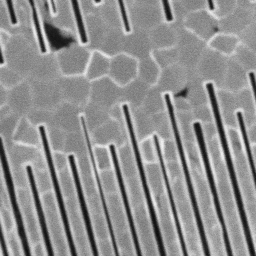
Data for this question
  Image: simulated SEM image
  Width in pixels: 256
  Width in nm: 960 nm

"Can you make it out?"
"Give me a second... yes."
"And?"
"parallel lines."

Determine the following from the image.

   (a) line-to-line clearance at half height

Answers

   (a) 21.4 nm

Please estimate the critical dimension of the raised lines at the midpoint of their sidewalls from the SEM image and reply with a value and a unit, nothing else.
59.9 nanometres